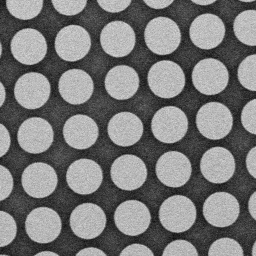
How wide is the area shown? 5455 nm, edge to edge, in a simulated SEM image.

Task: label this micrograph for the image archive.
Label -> an array of small figures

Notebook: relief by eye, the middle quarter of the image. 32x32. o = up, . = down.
..............oo......ooooooo...
..oo........ooooo....oooooooo...
oooooo.....ooooooo...ooooooooo..
ooooooo...ooooooooo..ooooooooo..
ooooooo...ooooooooo..ooooooooo..
ooooooo...ooooooooo..ooooooooo..
ooooooo....ooooooo....ooooooo...
ooooooo....oooooo......oooooo...
oooooo.......ooo................
.oooo...........................
................................
........................ooooo...
.............oooo......ooooooo..
..ooooo.....ooooooo...ooooooooo.
.ooooooo...oooooooo...ooooooooo.
oooooooo...ooooooooo..ooooooooo.
oooooooo...ooooooooo..ooooooooo.
oooooooo...ooooooooo..oooooooo..
oooooooo....ooooooo....oooooo...
.ooooooo....oooooo.......ooo....
..ooooo.........................
................................
.........................ooooo..
..............ooooo.....ooooooo.
..oooooo....oooooooo...oooooooo.
..ooooooo...oooooooo...ooooooooo
.oooooooo...ooooooooo..ooooooooo
.oooooooo...ooooooooo..ooooooooo
.ooooooooo..oooooooo....ooooooo.
.oooooooo...oooooooo....ooooooo.
.oooooooo....oooooo.......ooo...
..oooooo.......oo...............